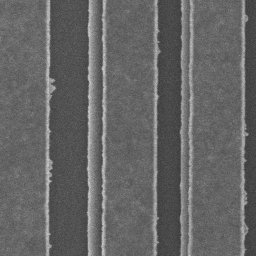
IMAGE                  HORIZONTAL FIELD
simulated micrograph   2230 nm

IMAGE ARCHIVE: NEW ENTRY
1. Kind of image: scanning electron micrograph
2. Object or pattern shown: lines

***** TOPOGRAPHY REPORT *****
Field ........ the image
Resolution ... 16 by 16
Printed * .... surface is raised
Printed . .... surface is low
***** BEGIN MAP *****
***...****..***.
***...****..***.
***...****..***.
***...****..***.
***...****..***.
***...****..***.
***...****..***.
***...****..***.
***...****..***.
***...****..***.
***...****..***.
***...****..***.
***...****..***.
***...****..***.
***...****..***.
***...****..***.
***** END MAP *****